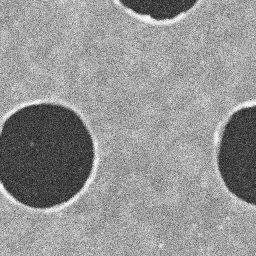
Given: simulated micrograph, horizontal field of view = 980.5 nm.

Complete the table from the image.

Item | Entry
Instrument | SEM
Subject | holes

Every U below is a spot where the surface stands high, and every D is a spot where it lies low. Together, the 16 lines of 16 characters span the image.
UUUUUUUUDDDDUUUU
UUUUUUUUUUUUUUUU
UUUUUUUUUUUUUUUU
UUUUUUUUUUUUUUUU
UUUUUUUUUUUUUUUU
UUUUUUUUUUUUUUUU
UUDDUUUUUUUUUUUU
DDDDDUUUUUUUUUDD
DDDDDDUUUUUUUUDD
DDDDDDUUUUUUUUDD
DDDDDDUUUUUUUUDD
DDDDDUUUUUUUUUDD
UDDDUUUUUUUUUUUD
UUUUUUUUUUUUUUUU
UUUUUUUUUUUUUUUU
UUUUUUUUUUUUUUUU